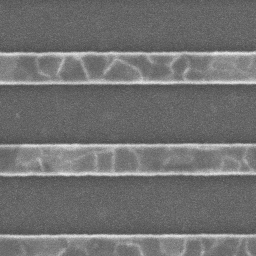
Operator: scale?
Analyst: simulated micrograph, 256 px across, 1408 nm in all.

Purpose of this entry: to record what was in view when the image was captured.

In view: one or a few lines or trenches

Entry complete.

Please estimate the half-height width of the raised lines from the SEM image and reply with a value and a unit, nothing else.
162 nm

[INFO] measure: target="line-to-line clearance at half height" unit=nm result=340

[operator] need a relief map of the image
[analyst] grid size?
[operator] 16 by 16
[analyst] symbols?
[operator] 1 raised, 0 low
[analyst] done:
0000000000000000
0000000000000000
0000000000000000
1111111111111111
1111111111111111
0000000000000000
0000000000000000
0000000000000000
0000000000000000
1111111111111111
1111111111111111
0000000000000000
0000000000000000
0000000000000000
0000000000000000
1111111111111111